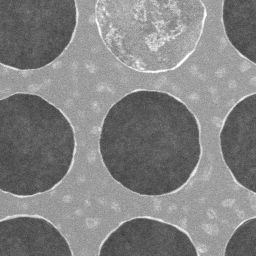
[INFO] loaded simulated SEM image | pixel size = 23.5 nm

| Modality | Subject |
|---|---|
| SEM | holes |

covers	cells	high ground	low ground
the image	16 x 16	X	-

-----XXXXXXXXX--
-----XXXXXXXXX--
----XXXXXXXXXX--
----XXXXXXXXXXX-
XXXXXXXXXXXXXXXX
XXXXXXXXXXXXXXXX
---XXXX----XXXX-
----XXX-----XX--
-----X------XX--
-----X-------X--
----XXX-----XX--
----XXXX----XXX-
XXXXXXXXXXXXXXXX
X-XXXXXXXXXXXXXX
----XXX----XXXX-
----XX------XX--